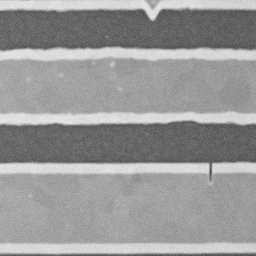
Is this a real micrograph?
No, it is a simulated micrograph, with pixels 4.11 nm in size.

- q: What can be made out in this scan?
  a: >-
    one or a few lines or trenches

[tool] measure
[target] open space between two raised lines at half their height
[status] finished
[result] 203 nm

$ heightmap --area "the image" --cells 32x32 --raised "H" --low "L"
HHHHHHHHHHHHHHHHHHHHHHLLHHLHHHLL
LLLLLLLLLLLLLLLLLLLLLLLLLLLLLLLL
LLLLLLLLLLLLLLLLLLLLLLLLLLLLLLLL
LLLLLLLLLLLLLLLLLLLLLLLLLLLLLLLL
LLLLLLLLLLLLLLLLLLLLLLLLLLLLLLLL
LLLLLLLLLLLLLLLLLLLLLLLLLLLLLLLL
LLLLLLLLLLLLLLLLLLLLLLLLLLLLLLLL
HHHHHHHHHHHHHHHHHHHHHHHHHHHHHHHH
HHHHHHHHHHHHHHHHHHHHHHHHHHHHHHHH
HHHHHHHHHHHHHHHHHHHHHHHHHHHHHHHH
HHHHHHHHHHHHHHHHHHHHHHHHHHHHHHHH
HHHHHHHHHHHHHHHHHHHHHHHHHHHHHHHH
HHHHHHHHHHHHHHHHHHHHHHHHHHHHHHHH
HHHHHHHHHHHHHHHHHHHHHHHHHHHHHHHH
HHHHHHHHHHHHHHHHHHHHHHHHHHHHHHHH
LLLLLLLLLLLLLLLLLLLLLLLLLLLLLLLL
LLLLLLLLLLLLLLLLLLLLLLLLLLLLLLLL
LLLLLLLLLLLLLLLLLLLLLLLLLLLLLLLL
LLLLLLLLLLLLLLLLLLLLLLLLLLLLLLLL
LLLLLLLLLLLLLLLLLLLLLLLLLLLLLLLL
LLLLLLLLLLLLLLLLLLLLLLLLLLLLLLLL
HHHHHHHHHHHHHHHHHHHHHHHHHHHHHHHH
HHHHHHHHHHHHHHHHHHHHHHHHHHHHHHHH
HHHHHHHHHHHHHHHHHHHHHHHHHHHHHHHH
HHHHHHHHHHHHHHHHHHHHHHHHHHHHHHHH
HHHHHHHHHHHHHHHHHHHHHHHHHHHHHHHH
HHHHHHHHHHHHHHHHHHHHHHHHHHHHHHHH
HHHHHHHHHHHHHHHHHHHHHHHHHHHHHHHH
HHHHHHHHHHHHHHHHHHHHHHHHHHHHHHHH
HHHHHHHHHHHHHHHHHHHHHHHHHHHHHHHH
HHHHHHHHHHHHHHHHHHHHHHHHHHHHHHHH
LLLLLLLLLLLLLLLLLLLLLLLLLLLLLLLL